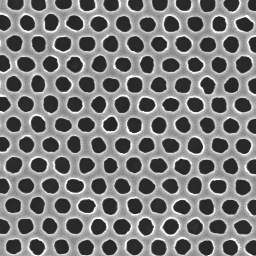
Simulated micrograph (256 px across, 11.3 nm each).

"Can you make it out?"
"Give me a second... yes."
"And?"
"a regular array of holes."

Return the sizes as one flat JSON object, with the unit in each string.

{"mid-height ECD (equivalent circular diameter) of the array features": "176 nanometers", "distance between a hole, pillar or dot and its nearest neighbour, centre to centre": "260 nm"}